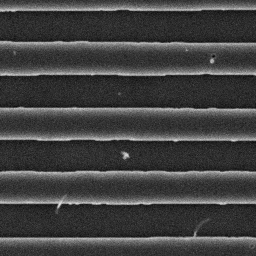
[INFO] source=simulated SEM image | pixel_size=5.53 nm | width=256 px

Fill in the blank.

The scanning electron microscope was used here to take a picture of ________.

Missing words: lines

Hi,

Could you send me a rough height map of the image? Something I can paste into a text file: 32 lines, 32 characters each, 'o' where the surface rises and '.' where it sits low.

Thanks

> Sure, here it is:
oooooooooooooooooooooooooooooooo
................................
................................
................................
................................
oooooooooooooooooooooooooooooooo
oooooooooooooooooooooooooooooooo
oooooooooooooooooooooooooooooooo
oooooooooooooooooooooooooooooooo
................................
................................
................................
................................
..o.............................
oooooooooooooooooooooooooooooooo
oooooooooooooooooooooooooooooooo
oooooooooooooooooooooooooooooooo
.....................oo.....oo..
................................
................................
................................
ooooo....oooooooooooo..oooooooo.
oooooooooooooooooooooooooooooooo
oooooooooooooooooooooooooooooooo
oooooooooooooooooooooooooooooooo
.......o........................
................................
................................
................................
................................
oooooooooooooooooooooooooooooooo
oooooooooooooooooooooooooooooooo